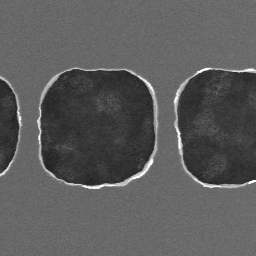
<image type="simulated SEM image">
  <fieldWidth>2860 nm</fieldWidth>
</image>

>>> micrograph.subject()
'holes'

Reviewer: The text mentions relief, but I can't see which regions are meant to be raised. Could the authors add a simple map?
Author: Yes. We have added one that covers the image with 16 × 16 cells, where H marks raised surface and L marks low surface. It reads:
HHHHHHHHHHHHHHHH
HHHHHHHHHHHHHHHH
HHHHHHHHHHHHHHHH
HHHHHHHHHHHHHHHH
HHHHLLLLHHHHHLLH
LHHLLLLLLHHLLLLL
LHHLLLLLLLHLLLLL
LHHLLLLLLLHLLLLL
LHHLLLLLLLHLLLLL
LHHLLLLLLLHLLLLL
HHHLLLLLLHHHLLLL
HHHHHLLHHHHHHLLH
HHHHHHHHHHHHHHHH
HHHHHHHHHHHHHHHH
HHHHHHHHHHHHHHHH
HHHHHHHHHHHHHHHH